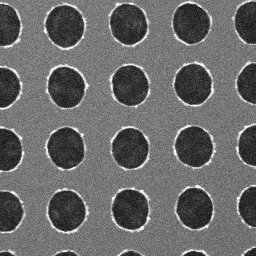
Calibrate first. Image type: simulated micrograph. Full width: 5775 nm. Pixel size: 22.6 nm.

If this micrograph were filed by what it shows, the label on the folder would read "a regular array of holes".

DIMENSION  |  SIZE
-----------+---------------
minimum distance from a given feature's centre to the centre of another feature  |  1380 nm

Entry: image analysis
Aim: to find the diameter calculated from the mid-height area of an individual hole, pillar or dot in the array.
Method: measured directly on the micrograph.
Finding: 892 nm